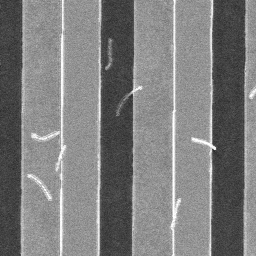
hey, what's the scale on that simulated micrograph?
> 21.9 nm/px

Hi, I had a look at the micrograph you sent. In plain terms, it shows lines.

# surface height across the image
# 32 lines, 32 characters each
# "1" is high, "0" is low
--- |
00011111111100000111111111100001
00011111111100000111111111100001
00011111111100000111111111100001
00011111111100000111111111000001
00011111111100000111111111000001
00011111111100000111111111000001
00011111111100000111111111000001
00011111111100000111111111000001
00011111111100000111111111000001
00011111111100000111111111000001
00011111111100000111111111000001
00011111111100000111111111000001
00011111111100000111111111000001
00011111111100000111111111000001
00011111111100000111111111000001
00011111111100000111111111000001
00011111111100000111111111000001
00011111111100000111111111000001
00011111111100000111111111100001
00011111111100000111111111000001
00011111111100000111111111000001
00011111111100000111111111000001
00011111111100000111111111000001
00011111111100000111111111000001
00011111111100000111111111000001
00011111111100000111111111000001
00011111111100000111111111000001
00011111111100000111111111000001
00011111111100000111111111000001
00011111111100000111111111000001
00011111111100000111111111000001
00011111111100000111111111000001